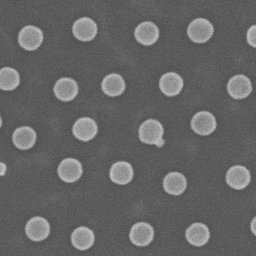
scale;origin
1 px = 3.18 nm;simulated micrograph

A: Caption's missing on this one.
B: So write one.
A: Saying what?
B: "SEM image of a regular array of raised bodies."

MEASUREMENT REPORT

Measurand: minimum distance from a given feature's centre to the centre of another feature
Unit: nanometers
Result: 163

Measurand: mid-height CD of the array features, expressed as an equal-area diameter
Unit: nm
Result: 75.2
